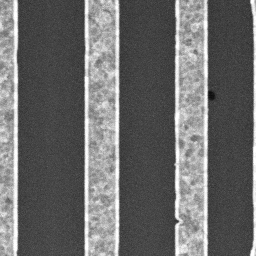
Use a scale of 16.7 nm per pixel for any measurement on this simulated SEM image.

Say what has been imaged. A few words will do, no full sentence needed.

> one or a few lines or trenches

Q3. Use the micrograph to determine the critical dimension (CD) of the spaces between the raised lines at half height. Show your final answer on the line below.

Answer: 999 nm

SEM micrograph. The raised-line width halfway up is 500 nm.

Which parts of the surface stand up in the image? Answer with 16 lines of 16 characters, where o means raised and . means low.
o....oo....oo...
o....oo....oo...
o....oo....oo...
o....oo....oo...
o....oo....oo...
o....oo....oo...
o....oo....oo...
o....oo....oo...
o....oo....oo...
o....oo....oo...
o....oo....oo...
o....oo....oo...
o....oo....oo...
o....oo....oo...
o....oo....oo...
o....oo....oo...